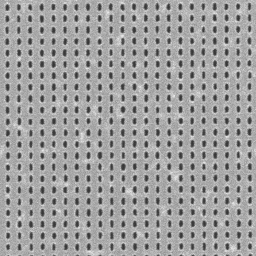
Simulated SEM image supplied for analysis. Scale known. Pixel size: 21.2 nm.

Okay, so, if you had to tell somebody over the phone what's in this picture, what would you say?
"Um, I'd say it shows a regular array of holes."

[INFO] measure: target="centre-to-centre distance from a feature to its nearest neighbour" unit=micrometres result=0.236